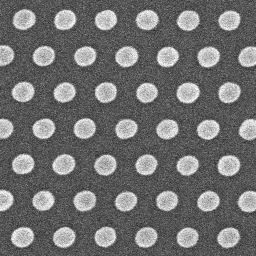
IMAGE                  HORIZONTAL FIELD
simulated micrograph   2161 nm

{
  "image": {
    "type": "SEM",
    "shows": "a regular array of raised bodies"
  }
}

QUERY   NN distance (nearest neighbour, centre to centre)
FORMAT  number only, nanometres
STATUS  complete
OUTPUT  347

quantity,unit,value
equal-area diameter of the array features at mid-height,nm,167